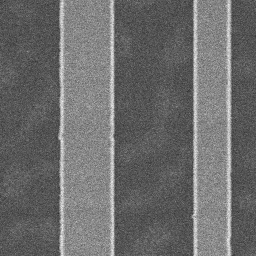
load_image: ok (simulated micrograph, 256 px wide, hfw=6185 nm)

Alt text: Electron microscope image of one or a few lines or trenches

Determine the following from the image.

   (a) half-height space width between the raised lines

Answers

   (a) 2010 nm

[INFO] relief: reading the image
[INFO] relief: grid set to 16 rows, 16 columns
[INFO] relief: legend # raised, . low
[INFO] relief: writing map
....###.....##..
....###.....##..
....###.....##..
....###.....##..
....###.....##..
....###.....##..
....###.....##..
....###.....##..
....###.....##..
....###.....##..
....###.....##..
....###.....##..
....###.....##..
....###.....##..
....###.....##..
....###.....##..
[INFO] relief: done